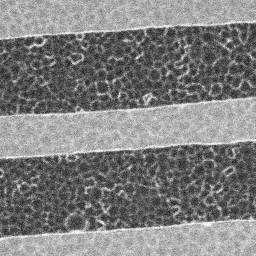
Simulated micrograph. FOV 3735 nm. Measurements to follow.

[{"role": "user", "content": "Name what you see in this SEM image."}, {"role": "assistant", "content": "one or a few lines or trenches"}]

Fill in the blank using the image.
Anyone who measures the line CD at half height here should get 1170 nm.